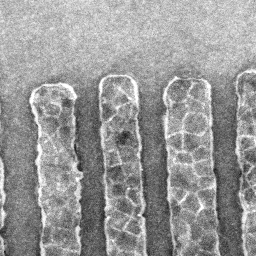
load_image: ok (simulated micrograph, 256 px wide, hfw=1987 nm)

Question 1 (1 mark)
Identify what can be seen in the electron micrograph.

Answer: one or a few lines or trenches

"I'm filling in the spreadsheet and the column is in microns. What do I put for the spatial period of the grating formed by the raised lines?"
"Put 0.518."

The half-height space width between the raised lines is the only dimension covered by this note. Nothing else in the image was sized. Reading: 0.215 µm